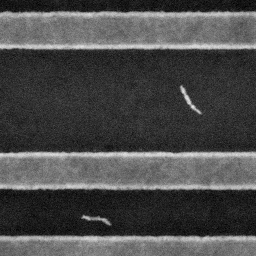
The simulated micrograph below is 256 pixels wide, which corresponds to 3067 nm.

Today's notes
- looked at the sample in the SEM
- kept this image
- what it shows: lines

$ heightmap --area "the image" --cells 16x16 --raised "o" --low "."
................
oooooooooooooooo
oooooooooooooooo
................
................
................
................
................
................
................
oooooooooooooooo
oooooooooooooooo
................
................
................
oooooooooooooooo